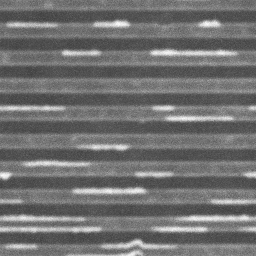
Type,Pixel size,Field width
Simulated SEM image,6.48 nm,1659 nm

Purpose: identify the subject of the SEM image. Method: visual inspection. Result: parallel lines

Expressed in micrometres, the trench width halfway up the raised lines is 0.0919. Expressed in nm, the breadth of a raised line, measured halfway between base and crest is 85.8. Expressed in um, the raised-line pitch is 0.179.